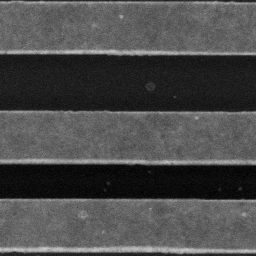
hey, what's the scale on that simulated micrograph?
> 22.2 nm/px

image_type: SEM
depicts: lines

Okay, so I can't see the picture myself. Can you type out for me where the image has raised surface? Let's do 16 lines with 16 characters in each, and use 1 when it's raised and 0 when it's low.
1111111111111111
1111111111111111
1111111111111111
0000000000000000
0000000000000000
0000000000000000
0000000000000000
1111111111111111
1111111111111111
1111111111111111
0000000000000000
0000000000000000
1111111111111000
1111111111111111
1111111111111111
1111111111111111